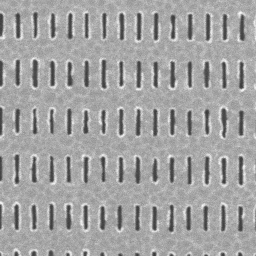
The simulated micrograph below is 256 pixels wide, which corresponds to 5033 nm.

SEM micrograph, a regular array of holes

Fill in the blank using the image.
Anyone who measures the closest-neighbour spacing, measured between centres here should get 335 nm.